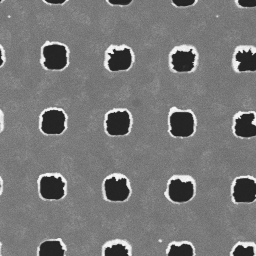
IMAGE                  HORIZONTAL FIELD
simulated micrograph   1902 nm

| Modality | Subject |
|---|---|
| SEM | a regular array of holes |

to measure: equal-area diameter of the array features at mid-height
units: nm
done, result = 182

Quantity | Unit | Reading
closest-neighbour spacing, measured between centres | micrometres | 0.476